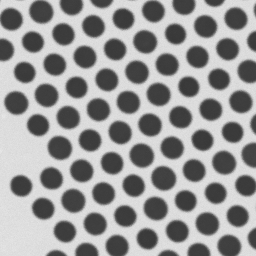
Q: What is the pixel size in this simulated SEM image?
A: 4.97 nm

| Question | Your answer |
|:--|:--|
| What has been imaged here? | a regular array of holes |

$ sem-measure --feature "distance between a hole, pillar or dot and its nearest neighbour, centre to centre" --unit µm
0.154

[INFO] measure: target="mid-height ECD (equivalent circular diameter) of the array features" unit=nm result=112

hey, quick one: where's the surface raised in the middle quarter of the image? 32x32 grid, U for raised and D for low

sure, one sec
DUUUDDDUUUUUUUUUDDDDDUUDDDDDDUUU
UUUUUUUUUDDDUUUDDDDDDUUDDDDDUUUU
UUUUUUUUDDDDDUUDDDDDDUUUDDDDUUUU
UUDDDUUUDDDDDUUUDDDDDUUUUUUUUUDD
UDDDDUUUDDDDDDUUUDDDUUUUUUUUUDDD
DDDDDDUUDDDDDUUUUUUUUUDDDDUUUDDD
UDDDDDUUUDDDUUUUUUUUUDDDDDUUUDDD
UDDDDUUUUUUUUUDDDDUUUDDDDDDUUDDD
UUDDUUUUUUUUUDDDDDDUUDDDDDDUUUUU
UUUUUUDDDDUUUDDDDDDUUUDDDDUUUUUU
DUUUUUDDDDDUUDDDDDDUUUUUUUUUUUUU
DDDUUUDDDDDDUUDDDDUUUUUUUUUDDDDU
DDDDUUDDDDDUUUUUUUUUDDUUUUDDDDDD
DDDDUUUDDDDUUUUUUUUDDDDDUUDDDDDD
DDDDUUUUUUUUUDDUUUUDDDDDUUUDDDDD
DDDUUUUUUUUDDDDDUUUDDDDDUUUDDDDU
UUUUUDDUUUUDDDDDDUUDDDDDUUUUUUUU
UUUUDDDDDUUDDDDDDUUUDDDDUUUUUUUU
UUUUDDDDDUUUDDDDDUUUUUUUUDDDUUUU
DUUUDDDDDUUUDDDDUUUUUUUUDDDDDUUU
DDUUDDDDDUUUUUUUUDDDDUUUDDDDDDUU
DDUUUDDDUUUUUUUUUDDDDDUUDDDDDDUU
DDUUUUUUUUDDDDUUDDDDDDUUUDDDDDUU
DUUUUUUUUDDDDDUUUDDDDDUUUUDDUUUU
UUUDDDUUUDDDDDDUUDDDDDUUUUUUUUUD
UUDDDDDUUDDDDDDUUUDDDUUUUUUUUUDD
UUDDDDDUUUDDDDUUUUUUUUUDDDDUUUDD
UUDDDDDUUUUDDUUUUUUUUUDDDDDDUUDD
UUDDDDDUUUUUUUUDDDDUUUDDDDDDUUUD
UUUUDUUUUUUUUUUDDDDDUUDDDDDDUUUU
UUUUUUUUDDDDUUUDDDDDUUUDDDDUUUUU
UDDDUUUDDDDDDUUDDDDDUUUUDDUUUUUU